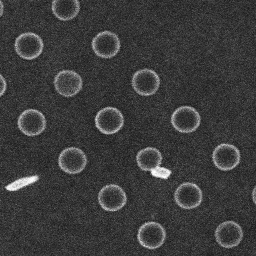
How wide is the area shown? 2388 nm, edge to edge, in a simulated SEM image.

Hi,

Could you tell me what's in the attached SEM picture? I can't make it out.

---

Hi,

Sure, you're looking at a regular array of raised bodies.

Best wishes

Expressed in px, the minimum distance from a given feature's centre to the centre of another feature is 54.2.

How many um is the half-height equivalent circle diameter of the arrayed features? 0.247